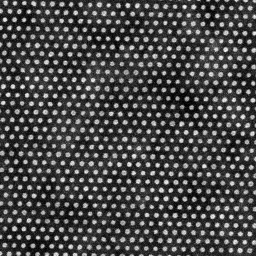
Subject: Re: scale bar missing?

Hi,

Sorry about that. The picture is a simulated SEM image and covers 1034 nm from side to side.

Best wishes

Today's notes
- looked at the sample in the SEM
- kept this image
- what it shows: a regular array of raised bodies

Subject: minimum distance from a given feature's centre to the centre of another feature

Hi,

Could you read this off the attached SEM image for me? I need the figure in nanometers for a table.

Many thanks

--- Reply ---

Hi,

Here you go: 36.4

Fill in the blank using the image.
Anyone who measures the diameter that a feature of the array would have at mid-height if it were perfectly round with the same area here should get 17.1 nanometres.